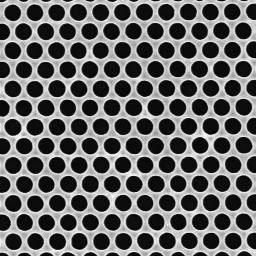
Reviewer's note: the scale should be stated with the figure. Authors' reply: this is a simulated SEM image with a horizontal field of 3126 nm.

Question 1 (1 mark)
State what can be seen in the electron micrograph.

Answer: a regular array of holes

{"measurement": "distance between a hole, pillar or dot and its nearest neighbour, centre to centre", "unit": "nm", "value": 266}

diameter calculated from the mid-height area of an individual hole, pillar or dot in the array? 202 nanometers